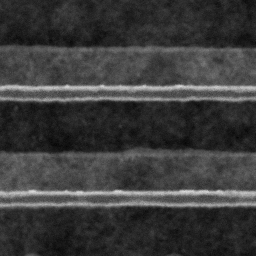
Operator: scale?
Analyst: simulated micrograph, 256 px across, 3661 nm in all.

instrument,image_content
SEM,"lines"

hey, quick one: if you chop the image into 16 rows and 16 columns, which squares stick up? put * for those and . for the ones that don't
................
................
................
****************
****************
****************
................
................
................
................
****************
****************
****************
................
................
................